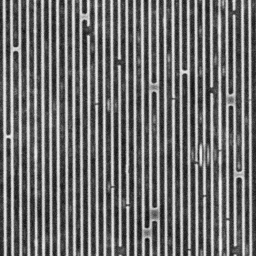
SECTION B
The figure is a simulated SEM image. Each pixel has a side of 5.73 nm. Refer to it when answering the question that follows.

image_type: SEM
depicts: parallel lines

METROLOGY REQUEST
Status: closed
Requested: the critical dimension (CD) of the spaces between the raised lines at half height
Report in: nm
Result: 29.4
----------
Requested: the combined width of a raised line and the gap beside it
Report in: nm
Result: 44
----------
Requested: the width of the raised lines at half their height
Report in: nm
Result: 10